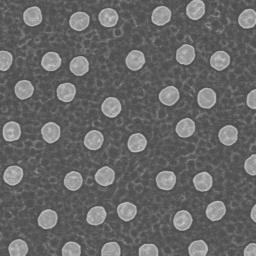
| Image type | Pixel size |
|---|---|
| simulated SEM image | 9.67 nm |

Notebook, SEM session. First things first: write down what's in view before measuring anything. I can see a regular array of raised bodies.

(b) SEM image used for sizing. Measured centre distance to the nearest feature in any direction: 35.9 pixels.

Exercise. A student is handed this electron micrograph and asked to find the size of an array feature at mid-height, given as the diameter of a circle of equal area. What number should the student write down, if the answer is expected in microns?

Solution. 0.185